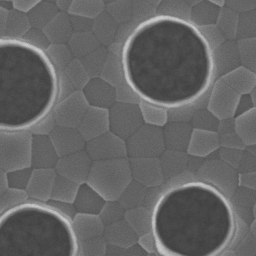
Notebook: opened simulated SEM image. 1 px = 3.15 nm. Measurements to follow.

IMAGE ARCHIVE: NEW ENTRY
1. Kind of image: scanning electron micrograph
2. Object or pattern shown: holes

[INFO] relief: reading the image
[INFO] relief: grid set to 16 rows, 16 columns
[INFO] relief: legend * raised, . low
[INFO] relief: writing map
****************
**********.*****
********.....***
..******.....***
...*****.....***
...******....***
...*************
..**************
****************
****************
****************
****************
**********....**
*..*******....**
....******....**
....*******...**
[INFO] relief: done